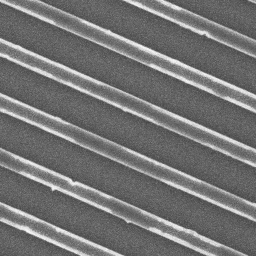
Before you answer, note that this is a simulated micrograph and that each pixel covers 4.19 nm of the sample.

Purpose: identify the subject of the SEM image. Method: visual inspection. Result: parallel lines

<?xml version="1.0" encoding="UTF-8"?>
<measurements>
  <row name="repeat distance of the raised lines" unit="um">0.21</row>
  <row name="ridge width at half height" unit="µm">0.0657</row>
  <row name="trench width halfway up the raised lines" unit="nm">143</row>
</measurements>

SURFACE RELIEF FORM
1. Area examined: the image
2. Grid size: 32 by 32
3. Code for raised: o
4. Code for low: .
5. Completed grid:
.ooooo...........oooo...........
...ooooo...........ooooo........
.....ooooo...........ooooo......
........ooooo..........ooooo....
..........ooooo...........ooooo.
o...........ooooo...........oooo
oooo...........oooo...........oo
.ooooo...........ooooo..........
...oooooo..........ooooo........
......ooooo..........ooooo......
........ooooo...........ooooo...
..........oooooo..........ooooo.
oo...........ooooo..........oooo
oooo...........ooooo...........o
..ooooo..........ooooo..........
....ooooo...........ooooo.......
......ooooo...........ooooo.....
.........oooo...........ooooo...
...........ooooo..........ooooo.
oo...........ooooo...........ooo
oooo...........ooooo...........o
..ooooo...........ooooo.........
....ooooo...........ooooo.......
.......oooo...........ooooo.....
.........ooooo...........ooooo..
...........ooooo...........ooooo
ooo...........oooo...........ooo
ooooo...........ooooo...........
..ooooo...........ooooo.........
.....ooooo..........ooooo.......
.......ooooo...........oooo.....
.........ooooo...........ooooo..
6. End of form